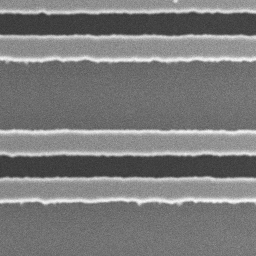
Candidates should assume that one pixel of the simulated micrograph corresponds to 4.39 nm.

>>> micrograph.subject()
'lines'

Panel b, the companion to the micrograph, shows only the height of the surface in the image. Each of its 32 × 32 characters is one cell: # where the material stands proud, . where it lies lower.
################################
################################
................................
................................
#####################..########.
################################
################################
.#########.#####################
................................
................................
................................
................................
................................
................................
................................
................................
################################
################################
################################
.#.##........##...#.............
................................
................................
################################
################################
################################
................................
................................
................................
................................
................................
................................
................................